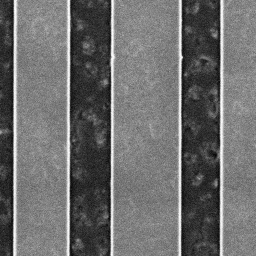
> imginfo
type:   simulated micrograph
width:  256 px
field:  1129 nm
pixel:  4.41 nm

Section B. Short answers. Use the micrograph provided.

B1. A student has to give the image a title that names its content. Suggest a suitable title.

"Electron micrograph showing one or a few lines or trenches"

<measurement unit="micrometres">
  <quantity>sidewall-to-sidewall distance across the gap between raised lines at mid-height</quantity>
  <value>0.18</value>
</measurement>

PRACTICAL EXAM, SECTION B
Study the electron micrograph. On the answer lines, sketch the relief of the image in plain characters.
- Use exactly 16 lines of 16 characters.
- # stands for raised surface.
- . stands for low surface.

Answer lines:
.###...####...##
.###...####...##
.###...####...##
.###...####...##
.###...####...##
.###...####...##
.###...####...##
.###...####...##
.###...####...##
.###...####...##
.###...####...##
.###...####...##
.###...####...##
.###...####...##
.###...####...##
.###...####...##